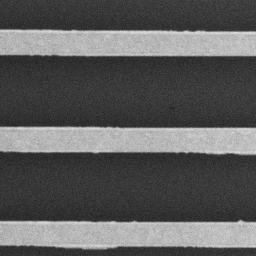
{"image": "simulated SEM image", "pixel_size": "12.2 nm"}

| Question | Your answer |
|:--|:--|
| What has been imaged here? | lines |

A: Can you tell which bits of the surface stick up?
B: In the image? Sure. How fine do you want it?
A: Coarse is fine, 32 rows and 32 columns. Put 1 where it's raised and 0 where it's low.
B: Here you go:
00000000000000000000000000000000
00000000000000000000000000000000
00000000000000000000000000000000
00000000000000000000000000000000
11111111111111111111111111111111
11111111111111111111111111111111
11111111111111111111111111111111
00000000000000000000000000000000
00000000000000000000000000000000
00000000000000000000000000000000
00000000000000000000000000000000
00000000000000000000000000000000
00000000000000000000000000000000
00000000000000000000000000000000
00000000000000000000000000000000
00000000000000000000000000000000
11111111111111111111111111111111
11111111111111111111111111111111
11111111111111111111111111111111
00000000000000000000000000000000
00000000000000000000000000000000
00000000000000000000000000000000
00000000000000000000000000000000
00000000000000000000000000000000
00000000000000000000000000000000
00000000000000000000000000000000
00000000000000000000000000000000
00000000000000000000000000000000
11111111111111111111111111111111
11111111111111111111111111111111
11111111111111111111111111111111
00000000000000000000000000000000